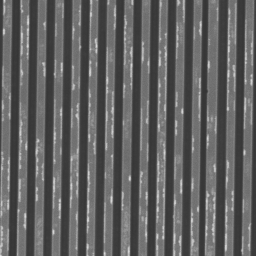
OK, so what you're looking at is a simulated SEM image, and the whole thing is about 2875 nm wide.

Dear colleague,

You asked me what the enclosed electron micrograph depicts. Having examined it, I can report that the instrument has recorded parallel lines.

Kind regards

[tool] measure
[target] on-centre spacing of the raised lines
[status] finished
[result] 194 nanometres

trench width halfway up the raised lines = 87.1 nm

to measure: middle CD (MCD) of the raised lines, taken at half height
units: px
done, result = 9.5